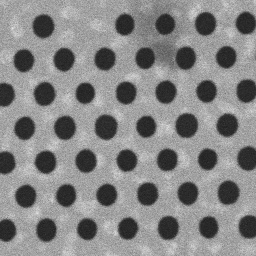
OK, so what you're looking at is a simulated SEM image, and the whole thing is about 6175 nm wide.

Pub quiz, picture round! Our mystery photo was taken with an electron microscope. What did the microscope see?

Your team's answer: a regular array of holes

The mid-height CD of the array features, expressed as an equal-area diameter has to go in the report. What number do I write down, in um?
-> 0.532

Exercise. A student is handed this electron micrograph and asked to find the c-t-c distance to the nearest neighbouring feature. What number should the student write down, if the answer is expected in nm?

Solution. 946